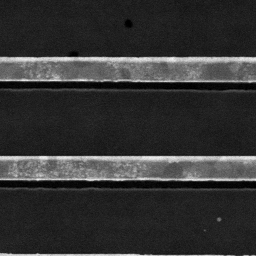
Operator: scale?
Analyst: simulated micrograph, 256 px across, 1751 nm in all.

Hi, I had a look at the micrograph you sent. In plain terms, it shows lines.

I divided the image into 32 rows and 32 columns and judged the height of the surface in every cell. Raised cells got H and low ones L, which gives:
LLLLLLLLLLLLLLLLLLLLLLLLLLLLLLLL
LLLLLLLLLLLLLLLLLLLLLLLLLLLLLLLL
LLLLLLLLLLLLLLLLLLLLLLLLLLLLLLLL
LLLLLLLLLLLLLLLLLLLLLLLLLLLLLLLL
LLLLLLLLLLLLLLLLLLLLLLLLLLLLLLLL
LLLLLLLLLLLLLLLLLLLLLLLLLLLLLLLL
LLLLLLLLLLLLLLLLLLLLLLLLLLLLLLLL
HHHHHHHHHHHHHHHHHHHHHHHHHHHHHHHH
HHHHHHHHHHHHHHHHHHHHHHHHHHHHHHHH
HHHHHHHHHHHHHHHHHHHHHHHHHHHHHHHH
LLLLLLLLLLLLLLLLLLLLLLLLLLLLLLLL
LLLLLLLLLLLLLLLLLLLLLLLLLLLLLLLL
LLLLLLLLLLLLLLLLLLLLLLLLLLLLLLLL
LLLLLLLLLLLLLLLLLLLLLLLLLLLLLLLL
LLLLLLLLLLLLLLLLLLLLLLLLLLLLLLLL
LLLLLLLLLLLLLLLLLLLLLLLLLLLLLLLL
LLLLLLLLLLLLLLLLLLLLLLLLLLLLLLLL
LLLLLLLLLLLLLLLLLLLLLLLLLLLLLLLL
LLLLLLLLLLLLLLLLLLLLLLLLLLLLLLLL
LLLLLLLLLLLLLLLLLLLLLLLLLLLLLLLL
HHHHHHHHHHHHHHHHHHHHHHHHHHHHHHHH
HHHHHHHHHHHHHHHHHHHHHHHHHHHHHHHH
LLLLLLLLLLLHLLLLLLLLLLLLLLLHHHLH
LLLLLLLLLLLLLLLLLLLLLLLLLLLLLLLL
LLLLLLLLLLLLLLLLLLLLLLLLLLLLLLLL
LLLLLLLLLLLLLLLLLLLLLLLLLLLLLLLL
LLLLLLLLLLLLLLLLLLLLLLLLLLLLLLLL
LLLLLLLLLLLLLLLLLLLLLLLLLLLLLLLL
LLLLLLLLLLLLLLLLLLLLLLLLLLLLLLLL
LLLLLLLLLLLLLLLLLLLLLLLLLLLLLLLL
LLLLLLLLLLLLLLLLLLLLLLLLLLLLLLLL
LLLLLLLLLLLLLLLLLLLLLLLLLLLLLLLL